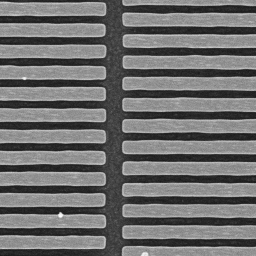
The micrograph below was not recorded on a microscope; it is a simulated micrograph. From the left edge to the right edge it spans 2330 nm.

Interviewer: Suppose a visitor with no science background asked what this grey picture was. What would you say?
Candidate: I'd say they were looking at groups of lines, slits or small figures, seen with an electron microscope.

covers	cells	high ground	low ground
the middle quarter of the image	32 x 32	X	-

---------------XXXXXXXXXXXXXXXXX
XXXXXXXXXX----------------------
XXXXXXXXXX----------------------
XXXXXXXXXX-----XXXXXXXXXXXXXXXXX
---------------XXXXXXXXXXXXXXXXX
---------------XXXXXXXXXXXXXXXXX
XXXXXXXXXX----------------------
XXXXXXXXXX----------------------
XXXXXXXXXX-------------------XX-
---------------XXXXXXXXXXXXXXXXX
---------------XXXXXXXXXXXXXXXXX
XXXXXXXXXX-----XXXXXXXXXXXXXXXXX
XXXXXXXXXX----------------------
XXXXXXXXXX----------------------
---------------XXXXXXXXXXXXXXXXX
---------------XXXXXXXXXXXXXXXXX
---------------XXXXXXXXXXXXXXXXX
XXXXXXXXXX----------------------
XXXXXXXXXX----------------------
XXXXXXXXXX-----XXXXXXXXXXXXXXXXX
---------------XXXXXXXXXXXXXXXXX
---------------XXXXXXXXXXXXXXXXX
XXXXXXXXXX------XXXXXXXXXX------
XXXXXXXXXX----------------------
XXXXXXXXXX-----XXXXXXXXXXX-XXXXX
---------------XXXXXXXXXXXXXXXXX
---------------XXXXXXXXXXXXXXXXX
XXXXXXXXXX-----XXXXXXXXXXXXXXXXX
XXXXXXXXXX----------------------
XXXXXXXXXX----------------------
---------------XXXXXXXXXXXXXXXXX
---------------XXXXXXXXXXXXXXXXX